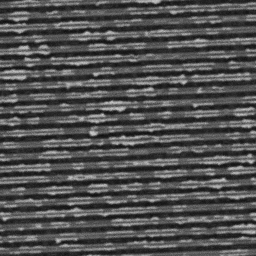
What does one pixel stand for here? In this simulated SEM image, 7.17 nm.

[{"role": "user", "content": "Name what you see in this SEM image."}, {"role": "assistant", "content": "parallel lines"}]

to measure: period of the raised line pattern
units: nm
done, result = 83.9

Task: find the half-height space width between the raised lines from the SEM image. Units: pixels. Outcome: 5.75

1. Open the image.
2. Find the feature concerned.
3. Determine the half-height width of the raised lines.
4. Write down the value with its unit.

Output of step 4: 0.0412 um